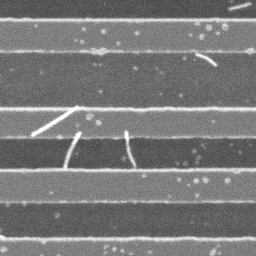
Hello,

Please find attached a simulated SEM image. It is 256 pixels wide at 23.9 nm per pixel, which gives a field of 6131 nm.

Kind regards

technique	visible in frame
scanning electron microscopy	lines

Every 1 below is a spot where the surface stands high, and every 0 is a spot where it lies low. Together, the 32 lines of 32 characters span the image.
00000000000000000000000000000000
00000000000000000000000000000000
11111111111111111111111111111111
11111111111111111111111111111111
11111111111111111111111111111111
11111111111111111111111111111111
00000000000111000100000000000001
00000000000000000000000000000000
00000000000000000000000000000000
00000000000000000000000000000000
00000000000000000000000000000000
00000000000000000000000000000000
00000000000000000000000000000000
00000000011000000000010000100000
11111111111111111111111111111111
11111111111111111111111111111111
11111111111111111111111111111111
00000000010000000000000000000000
00000000000000000000000000000000
00000000000000000000000000000000
00000000000000000000000000000000
11111111111111111111111111111111
11111111111111111111111111111111
11111111111111111111111111111111
11111111111111111111111111111111
00000000000000000000000000000000
00000000000000000000000000000000
00000000000000000000000000000000
00000000000000000000000000000000
00000000000000000000000000000000
11111111111111111111111111111111
11111111111111111111111111111111